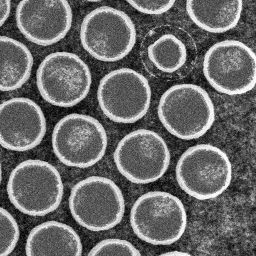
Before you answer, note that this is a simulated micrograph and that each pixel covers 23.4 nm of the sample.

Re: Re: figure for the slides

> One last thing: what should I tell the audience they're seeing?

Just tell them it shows a regular array of raised bodies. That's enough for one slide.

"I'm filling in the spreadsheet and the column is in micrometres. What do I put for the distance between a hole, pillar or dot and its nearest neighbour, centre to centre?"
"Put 1.47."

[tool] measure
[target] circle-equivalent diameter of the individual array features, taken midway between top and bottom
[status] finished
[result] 1.19 µm